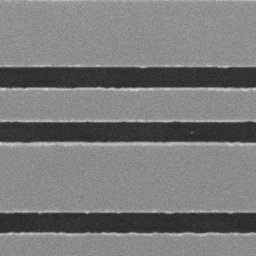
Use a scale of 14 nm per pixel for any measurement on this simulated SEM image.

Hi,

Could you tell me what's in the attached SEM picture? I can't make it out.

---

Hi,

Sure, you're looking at lines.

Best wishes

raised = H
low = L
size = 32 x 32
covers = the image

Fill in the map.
HHHHHHHHHHHHHHHHHHHHHHHHHHHHHHHH
HHHHHHHHHHHHHHHHHHHHHHHHHHHHHHHH
HHHHHHHHHHHHHHHHHHHHHHHHHHHHHHHH
HHHHHHHHHHHHHHHHHHHHHHHHHHHHHHHH
HHHHHHHHHHHHHHHHHHHHHHHHHHHHHHHH
HHHHHHHHHHHHHHHHHHHHHHHHHHHHHHHH
HHHHHHHHHHHHHHHHHHHHHHHHHHHHHHHH
HHHHHHHHHHHHHHHHHHHHHHHHHHHHHHHH
LLLLLLLLLLLLLLLLLLLLLLLLLLLLLLLL
LLLLLLLLLLLLLLLLLLLLLLLLLLLLLLLL
LLLLLLLLLLLLLLLLLLLLLLLLLLLLLLLL
HHHHHHHHHHHHHHHHHHHHHHHHHHHHHHHH
HHHHHHHHHHHHHHHHHHHHHHHHHHHHHHHH
HHHHHHHHHHHHHHHHHHHHHHHHHHHHHHHH
HHHHHHHHHHHHHHHHHHHHHHHHHHHHHHHH
LLLLLLLLLLLLLLLLLLLLLLLLLLLLLLLL
LLLLLLLLLLLLLLLLLLLLLLLLLLLLLLLL
LLLLLLLLLLLLLLLLLLLLLLLLLLLLLLLL
HHHHHHHHHHHHHHHHHHHHHHHHHHHHHHHH
HHHHHHHHHHHHHHHHHHHHHHHHHHHHHHHH
HHHHHHHHHHHHHHHHHHHHHHHHHHHHHHHH
HHHHHHHHHHHHHHHHHHHHHHHHHHHHHHHH
HHHHHHHHHHHHHHHHHHHHHHHHHHHHHHHH
HHHHHHHHHHHHHHHHHHHHHHHHHHHHHHHH
HHHHHHHHHHHHHHHHHHHHHHHHHHHHHHHH
HHHHHHHHHHHHHHHHHHHHHHHHHHHHHHHH
HHHHHHHHHHHHHHHHHHHHHHHHHHHHHHHH
LLLLLLLLLLLLLLLLLLLLLLLLLLLLLLLL
LLLLLLLLLLLLLLLLLLLLLLLLLLLLLLLL
HHHHHHHHHHHHHHHHHHHHHHHHHHHHHHHH
HHHHHHHHHHHHHHHHHHHHHHHHHHHHHHHH
HHHHHHHHHHHHHHHHHHHHHHHHHHHHHHHH